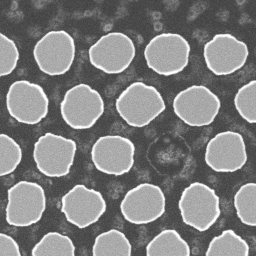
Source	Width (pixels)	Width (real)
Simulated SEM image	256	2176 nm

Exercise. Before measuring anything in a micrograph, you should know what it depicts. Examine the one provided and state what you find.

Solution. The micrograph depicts a regular array of raised bodies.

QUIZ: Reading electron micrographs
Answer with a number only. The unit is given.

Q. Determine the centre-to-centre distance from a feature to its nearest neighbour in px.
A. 55.8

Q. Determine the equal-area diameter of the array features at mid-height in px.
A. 41.8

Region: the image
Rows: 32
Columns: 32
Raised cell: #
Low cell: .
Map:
................................
................................
................................
................................
#.....###....###....###....##...
##...####...#####..####...####..
##..#####..######.######..#####.
##...####..#####..#####...#####.
##...####...####...####...####..
................................
..##.............#.............#
.####....###....####...###....##
.#####..#####..#####..#####..###
.#####..#####..#####..#####...##
..###...####...#####..#####...##
.........###....##......##......
............................#...
##...####...####..........####..
##..#####...#####.........#####.
###.#####...#####.........#####.
##...####...#####.........####..
#....###.....###................
................................
.####....##......###...###....##
.#####..#####...####...####..###
.#####..#####..######.#####..###
.####...#####..#####...####...##
.####....###....###....####...##
.........................#......
#.....##....####....##.....###..
##...####...####...####...#####.
##..#####...####..######..#####.